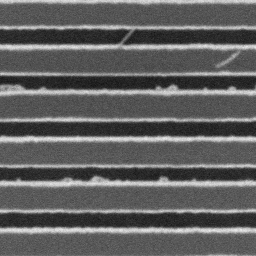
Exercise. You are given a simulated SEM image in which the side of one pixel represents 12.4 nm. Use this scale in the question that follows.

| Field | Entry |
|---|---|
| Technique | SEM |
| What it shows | lines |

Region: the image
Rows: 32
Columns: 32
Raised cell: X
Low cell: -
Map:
XXXXXXXXXXXXXXXXXXXXXXXXXXXXXXXX
XXXXXXXXXXXXXXXXXXXXXXXXXXXXXXXX
XXXXXXXXXXXXXXXXXXXXXXXXXXXXXXXX
-------X--------X--XXXX-X--XXX-X
--------------------------------
--------------------------------
XXXXXXXXXXXXXXXXXXXXXXXXXXXXXXXX
XXXXXXXXXXXXXXXXXXXXXXXXXXXXXXXX
XXXXXXXXXXXXXXXXXXXXXXXXXXXXXXXX
--------------------------------
--------------------------------
XXXXXXXXXXXXXXXXXXXX-XXXXXXXXXXX
XXXXXXXXXXXXXXXXXXXXXXXXXXXXXXXX
XXXXXXXXXXXXXXXXXXXXXXXXXXXXXXXX
XXXXXXXXXXXXXXXXXXXXXXXXXXXXXXXX
--------------------------------
--------------------------------
XXXXXXXXXXXXXXXXXXXXXXXXXXXXXXXX
XXXXXXXXXXXXXXXXXXXXXXXXXXXXXXXX
XXXXXXXXXXXXXXXXXXXXXXXXXXXXXXXX
XXXXXXXXXXXXXXXXXXXXXXXXXXXXXXXX
--------------------------------
--------------------------------
XXXXXXXXXXXXXXXXXXXXXXXXXXXXXXXX
XXXXXXXXXXXXXXXXXXXXXXXXXXXXXXXX
XXXXXXXXXXXXXXXXXXXXXXXXXXXXXXXX
---X--X--X--XX----XX--X-X-XXX---
--------------------------------
--------------------------------
XXXXXXXXXXXXXXXXXXXXXXXXXXXXXXXX
XXXXXXXXXXXXXXXXXXXXXXXXXXXXXXXX
XXXXXXXXXXXXXXXXXXXXXXXXXXXXXXXX